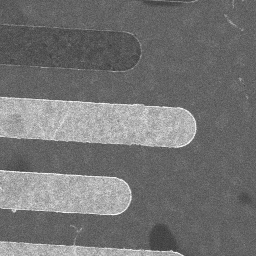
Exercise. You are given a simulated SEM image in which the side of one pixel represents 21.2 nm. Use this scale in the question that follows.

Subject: one or a few lines or trenches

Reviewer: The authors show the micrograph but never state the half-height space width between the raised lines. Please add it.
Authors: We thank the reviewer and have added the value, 0.707 µm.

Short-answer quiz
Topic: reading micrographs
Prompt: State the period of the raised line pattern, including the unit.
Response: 1540 nanometers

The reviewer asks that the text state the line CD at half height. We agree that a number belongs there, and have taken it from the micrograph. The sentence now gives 840 nm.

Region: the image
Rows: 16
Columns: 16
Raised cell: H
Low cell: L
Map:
LLLLLLLLLLLLLLLL
LLLLLLLLLLLLLLLL
HHHHHHHHHLLLLLLL
HHHHHHHHHLLLLLLL
LLLLLLLLLLLLLLLL
LLLLLLLLLLLLLLLL
HHHHHHHLLLLLLLLL
HHHHHHHHHHHHLLLL
HHHHHHHHHHHHLLLL
LLLLLLLLLLLLLLLL
LLLLLLLLLLLLLLLL
HHHHHHHHLLLLLLLL
HHHHHHHHLLLLLLLL
LLLLLLLLLLLLLLLL
LLLLLLLLLLLLLLLL
HHHHHHLLLLLLLLLL